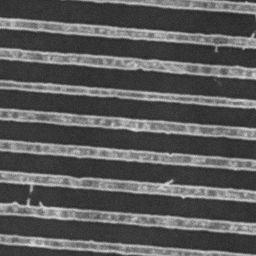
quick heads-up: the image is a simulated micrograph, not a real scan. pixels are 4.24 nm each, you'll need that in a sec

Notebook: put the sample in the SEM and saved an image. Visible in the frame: parallel lines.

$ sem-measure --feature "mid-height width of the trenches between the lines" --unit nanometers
90.8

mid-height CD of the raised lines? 41.2 nanometers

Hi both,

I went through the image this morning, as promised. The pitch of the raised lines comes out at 131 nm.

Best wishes